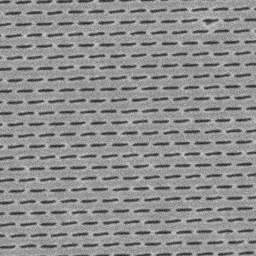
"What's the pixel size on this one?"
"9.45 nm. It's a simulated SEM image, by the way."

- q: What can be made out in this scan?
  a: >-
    a regular array of holes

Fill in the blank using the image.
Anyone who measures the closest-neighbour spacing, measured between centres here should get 14.8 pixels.